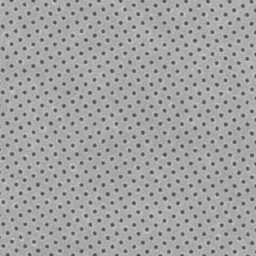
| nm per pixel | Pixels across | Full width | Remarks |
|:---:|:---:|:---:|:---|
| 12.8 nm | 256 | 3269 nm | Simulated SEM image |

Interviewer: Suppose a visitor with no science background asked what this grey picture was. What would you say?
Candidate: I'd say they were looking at a regular array of holes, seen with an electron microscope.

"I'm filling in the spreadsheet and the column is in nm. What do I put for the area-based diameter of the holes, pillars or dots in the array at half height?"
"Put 53.9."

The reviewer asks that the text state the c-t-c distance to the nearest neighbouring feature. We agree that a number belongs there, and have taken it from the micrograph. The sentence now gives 9.58 px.